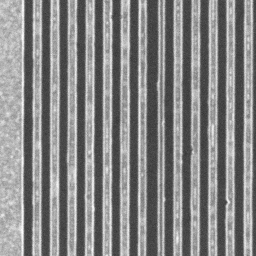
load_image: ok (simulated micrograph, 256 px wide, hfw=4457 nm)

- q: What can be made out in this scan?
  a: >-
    parallel lines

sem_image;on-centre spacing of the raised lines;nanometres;306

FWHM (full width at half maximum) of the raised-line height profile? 0.192 micrometres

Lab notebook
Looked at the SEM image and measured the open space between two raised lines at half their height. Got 102 nanometres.